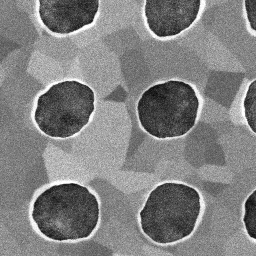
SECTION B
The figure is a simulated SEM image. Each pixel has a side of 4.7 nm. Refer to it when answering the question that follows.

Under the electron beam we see holes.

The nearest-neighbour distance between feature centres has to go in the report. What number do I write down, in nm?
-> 485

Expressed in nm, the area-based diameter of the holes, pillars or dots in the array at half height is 284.